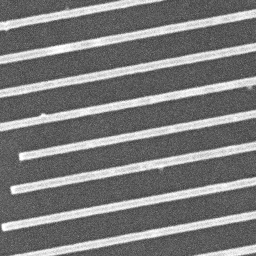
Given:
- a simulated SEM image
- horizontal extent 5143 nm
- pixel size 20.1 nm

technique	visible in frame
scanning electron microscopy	parallel lines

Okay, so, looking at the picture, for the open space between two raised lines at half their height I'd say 531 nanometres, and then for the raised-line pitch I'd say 664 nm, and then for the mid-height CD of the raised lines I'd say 0.128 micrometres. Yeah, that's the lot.